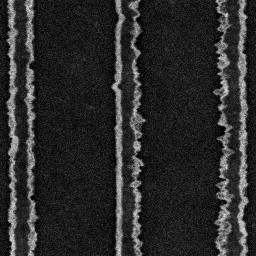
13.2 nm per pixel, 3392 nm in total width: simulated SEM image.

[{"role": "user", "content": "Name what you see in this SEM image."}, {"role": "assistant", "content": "one or a few lines or trenches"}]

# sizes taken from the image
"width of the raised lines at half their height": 0.242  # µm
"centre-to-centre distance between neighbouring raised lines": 1400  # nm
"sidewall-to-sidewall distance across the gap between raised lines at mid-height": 1160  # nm